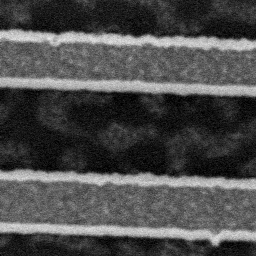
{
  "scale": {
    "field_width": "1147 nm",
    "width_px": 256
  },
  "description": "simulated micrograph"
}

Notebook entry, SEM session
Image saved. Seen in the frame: one or a few lines or trenches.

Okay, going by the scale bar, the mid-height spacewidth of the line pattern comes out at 413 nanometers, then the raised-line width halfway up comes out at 225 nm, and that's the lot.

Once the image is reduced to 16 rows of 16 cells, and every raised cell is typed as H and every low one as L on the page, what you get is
LLLLLLLLLLLLLLLL
LLLLLLLLLLLLLLLL
HHHHHHHHHHLLLLLL
HHHHHHHHHHHHHHHH
HHHHHHHHHHHHHHHH
LLLLLLLLLHHHHHHH
LLLLLLLLLLLLLLLL
LLLLLLLLLLLLLLLL
LLLLLLLLLLLLLLLL
LLLLLLLLLLLLLLLL
LLLLLLLLLLLLLLLL
HHHHHHHHHHHHHHLL
HHHHHHHHHHHHHHHH
HHHHHHHHHHHHHHHH
LLLLLLLLHHHHHHHH
LLLLLLLLLLLLLLLL